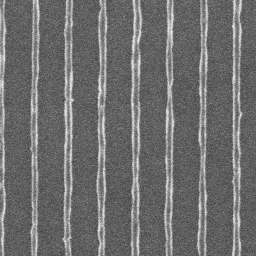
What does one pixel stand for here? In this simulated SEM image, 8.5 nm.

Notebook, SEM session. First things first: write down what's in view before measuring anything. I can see parallel lines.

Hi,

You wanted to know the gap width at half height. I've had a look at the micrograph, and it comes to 236 nm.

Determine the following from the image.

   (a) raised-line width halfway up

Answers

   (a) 6 pixels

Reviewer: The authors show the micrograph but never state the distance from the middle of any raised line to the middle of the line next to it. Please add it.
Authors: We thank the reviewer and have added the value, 286 nm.